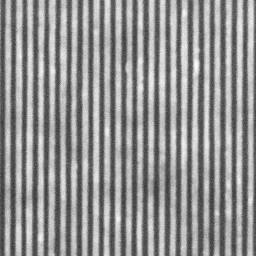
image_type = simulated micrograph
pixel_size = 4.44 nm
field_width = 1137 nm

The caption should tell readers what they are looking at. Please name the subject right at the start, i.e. parallel lines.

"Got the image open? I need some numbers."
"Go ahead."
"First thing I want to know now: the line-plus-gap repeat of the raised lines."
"11 px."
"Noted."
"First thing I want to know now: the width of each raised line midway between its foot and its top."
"4.37 px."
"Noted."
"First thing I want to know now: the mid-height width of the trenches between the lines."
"31.1 nanometers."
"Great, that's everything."